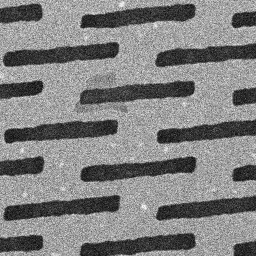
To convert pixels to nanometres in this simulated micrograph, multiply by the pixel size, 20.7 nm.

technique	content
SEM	holes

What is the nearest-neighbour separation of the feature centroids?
1580 nanometres